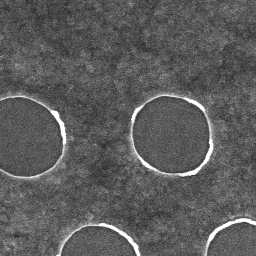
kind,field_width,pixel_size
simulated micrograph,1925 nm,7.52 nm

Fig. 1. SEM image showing holes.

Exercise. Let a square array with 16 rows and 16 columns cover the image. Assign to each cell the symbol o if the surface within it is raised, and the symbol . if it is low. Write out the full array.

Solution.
oooooooooooooooo
oooooooooooooooo
oooooooooooooooo
oooooooooooooooo
oooooooooooooooo
oooooooooooooooo
...oooooo...oooo
....oooo.....ooo
....oooo.....ooo
....ooooo....ooo
...ooooooo..oooo
oooooooooooooooo
oooooooooooooooo
oooooooooooooooo
ooooo..ooooooo..
oooo....ooooo...